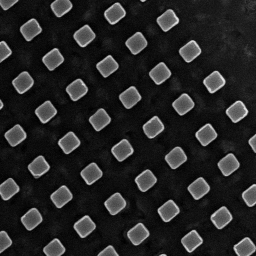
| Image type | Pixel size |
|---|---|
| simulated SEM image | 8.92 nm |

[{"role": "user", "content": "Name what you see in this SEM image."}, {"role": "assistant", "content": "a regular array of raised bodies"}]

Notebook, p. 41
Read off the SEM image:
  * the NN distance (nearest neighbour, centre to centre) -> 0.336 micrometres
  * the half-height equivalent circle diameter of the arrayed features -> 171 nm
